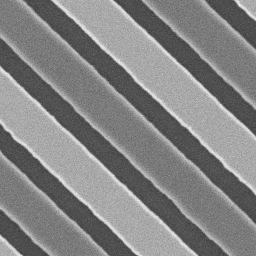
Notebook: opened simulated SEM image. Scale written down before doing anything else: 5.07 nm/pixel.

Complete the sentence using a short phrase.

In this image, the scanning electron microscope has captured lines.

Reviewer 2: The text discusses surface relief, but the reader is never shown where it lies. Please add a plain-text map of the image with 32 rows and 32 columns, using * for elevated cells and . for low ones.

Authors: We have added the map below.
***....********...********....**
****....********...********....*
*****....********...********....
******....********...********...
*******....********...********..
.********...********....*******.
..********...********....*******
...********...********...*******
....********...********....*****
*....********...********....****
**....********...********....***
***....********...********....**
****....********....*******....*
*****....********....*******....
******....********....*******...
*******....********....*******..
.********...********....*******.
..********...********....*******
...********...********....******
*...********....*******....*****
**...********....*******....****
***...********....*******....***
****...********....*******....**
*****...********....*******....*
******...********....*******....
*******....*******....*******...
********....*******....*******..
..*******....*******....*******.
...*******....*******....*******
....*******....*******....******
*....*******....*******....*****
**....*******....*******....****